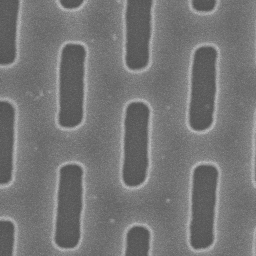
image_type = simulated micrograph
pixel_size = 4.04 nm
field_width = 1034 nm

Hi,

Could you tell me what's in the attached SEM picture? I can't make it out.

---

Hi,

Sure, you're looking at holes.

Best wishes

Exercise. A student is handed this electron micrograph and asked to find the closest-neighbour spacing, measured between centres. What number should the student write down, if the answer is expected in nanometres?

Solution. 353